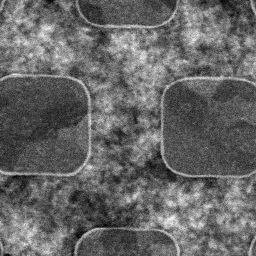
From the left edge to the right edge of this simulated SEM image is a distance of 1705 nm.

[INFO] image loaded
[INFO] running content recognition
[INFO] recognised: raised bodies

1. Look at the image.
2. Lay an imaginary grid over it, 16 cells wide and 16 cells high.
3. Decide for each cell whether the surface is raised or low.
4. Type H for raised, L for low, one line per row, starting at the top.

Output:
LLLLLHHHHHHLLLLL
LLLLLLHHHHLLLLLL
LLLLLLLLLLLLLLLL
LLLLLLLLLLLLLLLL
LLLLLLLLLLLLLLLL
HHHHHLLLLLHHHHHH
HHHHHHLLLLHHHHHH
HHHHHHLLLLHHHHHH
HHHHHHLLLLHHHHHH
HHHHHHLLLLHHHHHH
HHHHHLLLLLLHHHHH
LLLLLLLLLLLLLLLL
LLLLLLLLLLLLLLLL
LLLLLLLLLLLLLLLL
LLLLLLHHHHLLLLLL
LLLLLHHHHHHLLLLL